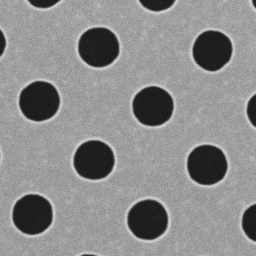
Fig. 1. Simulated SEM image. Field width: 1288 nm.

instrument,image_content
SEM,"a regular array of holes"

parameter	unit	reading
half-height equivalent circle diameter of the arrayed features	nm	205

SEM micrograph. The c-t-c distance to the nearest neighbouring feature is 404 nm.